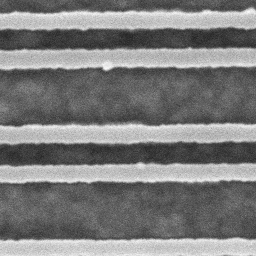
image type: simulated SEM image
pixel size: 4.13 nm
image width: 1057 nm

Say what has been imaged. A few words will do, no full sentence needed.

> lines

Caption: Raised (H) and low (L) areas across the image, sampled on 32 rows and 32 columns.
LLLLLLLLLLLLLLLLLLLLLLLLLLLLLLLL
LLLLLLLLLLLLLLLLHLLLLLLLLLHLLLHH
HHHHHHHHHHHHHHHHHHHHHHHHHHHHHHHH
HHHHHHHHHHHHHHHHHHHHHHHHHHHLLLHH
LLLLLLLLLLLLLLLLLLLLLLLLLLLLLLLL
LLLLLLLLLLLLLLLLLLLLLLLLLLLLLLLL
HHHHHHHHHHHHHHHHHHHHHHHHHHHHHHHH
HHHHHHHHHHHHHHHHHHHHHHHHHHHHHHHH
HHHHHLHLHHLLLHLLLLLLLLLLLLLLLLLL
LLLLLLLLLLLLLLLLLLLLLLLLLLLLLLLL
LLLLLLLLLLLLLLLLLLLLLLLLLLLLLLLL
LLLLLLLLLLLLLLLLLLLLLLLLLLLLLLLL
LLLLLLLLLLLLLLLLLLLLLLLLLLLLLLLL
LLLLLLLLLLLLLLLLLLLLLLLLLLLLLLLL
LLLLLLLLLLLLLLLLLLLLLLLLLLLLLLLL
LLLLLLLLLLLLLLLLLLLLLLLLLLLLLLLL
HHHHHHHHHHHHHHHHHHHHHHHHHHHHHHHH
HHHHHHHHHHHHHHHHHHHHHHHHHHHHHHHH
LLLLLLLLLLLLLLLLLLLLLLLLLLLLLLLL
LLLLLLLLLLLLLLLLLLLLLLLLLLLLLLLL
LLLLLLLLLLLLLLLLLHLLLLLLLLLLLLLL
HHHHHHHHHHHHHHHHHHHHHHHHHHHHHHHH
HHHHHHHHHHHHHHHHHHHHHHHHHHHLLLHH
LLLLLLLLLLLLLLLLLLLLLLLLLLLLLLLL
LLLLLLLLLLLLLLLLLLLLLLLLLLLLLLLL
LLLLLLLLLLLLLLLLLLLLLLLLLLLLLLLL
LLLLLLLLLLLLLLLLLLLLLLLLLLLLLLLL
LLLLLLLLLLLLLLLLLLLLLLLLLLLLLLLL
LLLLLLLLLLLLLLLLLLLLLLLLLLLLLLLL
LLLLLLLLLLLLLLLLLLLLLLLLLLLLLLLL
HHHHHHHHHHHHHHHHHHHHHHHHHHHHHHHH
HHHHHHHHHHHHHHHHHHHHHHHHHHHHHHHH